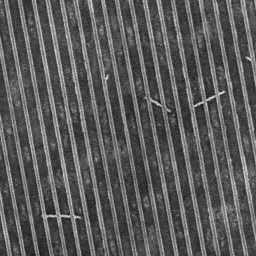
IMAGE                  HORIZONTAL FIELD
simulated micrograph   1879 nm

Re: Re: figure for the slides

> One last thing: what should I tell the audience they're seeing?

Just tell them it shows parallel lines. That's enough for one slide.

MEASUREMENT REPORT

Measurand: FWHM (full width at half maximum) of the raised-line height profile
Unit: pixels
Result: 2.96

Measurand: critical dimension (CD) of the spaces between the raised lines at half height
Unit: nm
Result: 79.5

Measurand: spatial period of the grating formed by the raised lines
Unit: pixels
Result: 13.7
